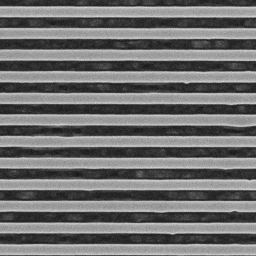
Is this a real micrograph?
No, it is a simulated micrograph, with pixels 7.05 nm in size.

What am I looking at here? parallel lines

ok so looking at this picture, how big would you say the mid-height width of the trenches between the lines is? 78.4 nanometres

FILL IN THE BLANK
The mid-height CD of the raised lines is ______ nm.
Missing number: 73.1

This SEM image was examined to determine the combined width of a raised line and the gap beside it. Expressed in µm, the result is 0.152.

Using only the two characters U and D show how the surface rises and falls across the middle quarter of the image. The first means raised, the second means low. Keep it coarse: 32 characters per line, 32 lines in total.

DDDDDDDDDDDDDDDDDDDDDDDDDDDDDDDD
DDDDDDDDDDDDDDDDDDDDDDDDDDDDDDDD
UUUUUUUUUUUUUUUUUUUUUUUUUUUUUUUU
UUUUUUUUUUUUUUUUUUUUUUUUUUUUUUUU
DDDDDDDDDDDUUUUUDDDDDDDDDDDDDDUU
DDDDDDDDDDDDDDDDDDDDDDDDDDDDDDDD
DDDDDDDDDDDDDDDDDDDDDDDDDDDDDDDD
DDUUUUUUUUUUUDDDUUDDUUUUUUUUUDUD
UUUUUUUUUUUUUUUUUUUUUUUUUUUUUUUU
UUUUUUUUUUUUUUUUUUUUUUUUUUUUUUUU
DDDDDDDDDDDDDDDDDDDDDDDDDDDDDDDD
DDDDDDDDDDDDDDDDDDDDDDDDDDDDDDDD
DDDDDDDDDDDDDDDDDDDDDDDDDDDDDDDD
UUUUUUUUUUUUUUUUUUUUUUUUUUUUUUUU
UUUUUUUUUUUUUUUUUUUUUUUUUUUUUUUU
DDDDDDDDDDDDDDDDDDDDDDDDDDDDDDDD
DDDDDDDDDDDDDDDDDDDDDDDDDDDDDDDD
DDDDDDDDDDDDDDDDDDDDDDDDDDDDDDDD
UUUUUUUUUUUUUUUUUUUUUUUUUUUUUUUU
UUUUUUUUUUUUUUUUUUUUUUUUUUUUUUUU
UUUUUUUUUUUUUUUUUUUUUUUUUUUUUUUU
DDDDDDDDDDDDDDDDDDDDDDDDDDDDDDDD
DDDDDDDDDDDDDDDDDDDDDDDDDDDDDDDD
DDDDDDDDDDDDDDDDDDDDDDDDDDDDDDDD
UUUUUUUUUUUUUUUUUUUUUUUUUUUUUUUU
UUUUUUUUUUUUUUUUUUUUUUUUUUUUUUUU
DDDDDDDDDDDDDDDDDDDDDDDDDDDDDDDD
DDDDDDDDDDDDDDDDDDDDDDDDDDDDDDDD
DDDDDDDDDDDDDDDDDDDDDDDDDDDDDDDD
UUUUUUUUUUUUUUUUUUUUUUUUUUUUUUUU
UUUUUUUUUUUUUUUUUUUUUUUUUUUUUUUU
DDDDDUUDDDDDDDDDDDDDDDDDDDDDDDDD